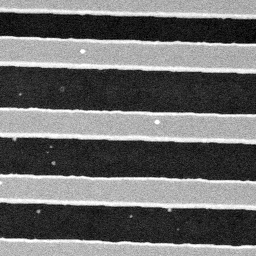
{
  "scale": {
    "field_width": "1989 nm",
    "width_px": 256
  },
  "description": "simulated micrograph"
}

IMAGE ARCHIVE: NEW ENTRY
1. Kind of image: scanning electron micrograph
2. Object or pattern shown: lines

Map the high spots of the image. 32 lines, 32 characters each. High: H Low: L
HHHHHHHHHHHHHHHHHHHHHHHHHHHHHHHH
LLLLLLHHHHHHHHHHHHHHHHHHHHHHHHHH
LLLLLLLLLLLLLLLLLLLLLLLLLLLLLLLL
LLLLLLLLLLLLLLLLLLLLLLLLLLLLLLLL
LLLLLLLLLLLLLLLLLLLLLLLLLLLLLLLL
HHHHHHHHHHHHHHHHHHHHHHHHHHHHLHLL
HHHHHHHHHHHHHHHHHHHHHHHHHHHHHHHH
HHHHHHHHHHHHHHHHHHHHHHHHHHHHHHHH
LLLLLLLLLLLLHHHHHHHHHHHHHHHHHHHH
LLLLLLLLLLLLLLLLLLLLLLLLLLLLLLLL
LLLLLLLLLLLLLLLLLLLLLLLLLLLLLLLL
LLLLLLLLLLLLLLLLLLLLLLLLLLLLLLLL
LLLLLLLLLLLLLLLLLLLLLLLLLLLLLLLL
LLLLLLLLLLLLLLLLLLLLLLLLLLLLLLLL
HHHHHHHHHHHHHHHHHHHHHHHHHHHHHHHH
HHHHHHHHHHHHHHHHHHHHHHHHHHHHHHHH
HHHHHHHHHHHHHHHHHHHHHHHHHHHHHHHH
LLLLLLLLLLLLLLLLLLLLLHHHHHHHHHHH
LLLLLLLLLLLLLLLLLLLLLLLLLLLLLLLL
LLLLLLLLLLLLLLLLLLLLLLLLLLLLLLLL
LLLLLLLLLLLLLLLLLLLLLLLLLLLLLLLL
LLLLLLLLLLLLLLLLLLLLLLLLLLLLLLLL
HHHHHHHHHHHHHHHHHHHHHHHHHHLLLLLL
HHHHHHHHHHHHHHHHHHHHHHHHHHHHHHHH
HHHHHHHHHHHHHHHHHHHHHHHHHHHHHHHH
LLLLLLLLLLLLHHHHHHHHHHHHHHHHHHHH
LLLLLLLLLLLLLLLLLLLLLLLLLLLLLLLL
LLLLLLLLLLLLLLLLLLLLLLLLLLLLLLLL
LLLLLLLLLLLLLLLLLLLLLLLLLLLLLLLL
LLLLLLLLLLLLLLLLLLLLLLLLLLLLLLLL
HHHHHHHHHHHHHHHHHHHHHHLHLLLLLLLL
HHHHHHHHHHHHHHHHHHHHHHHHHHHHHHHH